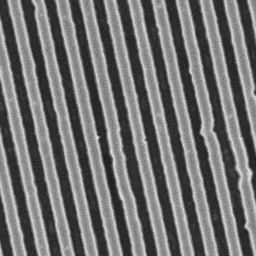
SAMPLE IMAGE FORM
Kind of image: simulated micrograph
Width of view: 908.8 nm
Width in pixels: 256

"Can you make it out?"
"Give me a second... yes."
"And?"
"parallel lines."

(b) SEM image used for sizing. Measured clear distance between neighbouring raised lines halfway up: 0.0382 microns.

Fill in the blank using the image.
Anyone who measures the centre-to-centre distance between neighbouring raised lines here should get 83.3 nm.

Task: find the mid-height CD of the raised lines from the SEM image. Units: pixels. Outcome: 12.5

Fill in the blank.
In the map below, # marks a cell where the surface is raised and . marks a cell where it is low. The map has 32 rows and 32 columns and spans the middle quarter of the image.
.####..####..####...###..####..#
..###...###...###...###...###..#
..###...###...###...###...###...
..###...###...###...###...###...
..####..###...###...###...###...
..####..####..####..###....###..
...###...###...###...###...###..
...###...###...###...###...###..
...###...###...###...###...###..
...####..####..###...###...###..
#..####...###...###...###..####.
#...###...###...###...###...###.
#...###...###...###...###...###.
#...###...###...###...###...###.
#...####..####...##...###...####
##...###..####...###...###...###
##...###...###...###...###...###
##...###...###...###...###...###
##...####..###...###...###...###
###..####..###...####...##...###
###...###..###....###...###...##
###...###..####...###...###...##
###...###..####...###...###...##
###...###...###...###...###...##
####..####..###....###..####...#
.###...###..###....###...###...#
.###...###..####...###...###...#
.###...###...###...###...###...#
.####..####..###...###....###..#
..###..####..###....###...###...
..###...###..####...###...###...
..###...###..####...###...###...